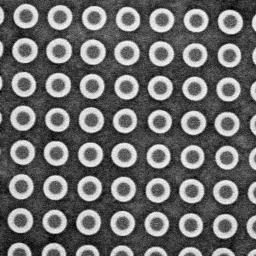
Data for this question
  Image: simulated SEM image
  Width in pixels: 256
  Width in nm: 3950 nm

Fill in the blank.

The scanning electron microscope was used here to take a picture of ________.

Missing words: an array of small figures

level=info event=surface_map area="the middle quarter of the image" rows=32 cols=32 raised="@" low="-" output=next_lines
--------------------------------
--------------------------------
--------------------------------
@----@@@@-----@@@-----@@@-------
@@--@@@@@@---@@@@@---@@@@@@---@@
@---@@@@@@---@@@@@---@@@@@@---@@
@---@@@@@@---@@@@@---@@@@@@---@@
@----@@@@----@@@@@----@@@@@---@@
------@@------@@@------@@@-----@
--------------------------------
--------------------------------
-----@@@@------@@---------------
@---@@@@@----@@@@@----@@@@----@@
@---@@@@@@--@@@@@@---@@@@@@---@@
@---@@@@@@--@@@@@@---@@@@@@--@@@
@---@@@@@@---@@@@@---@@@@@@---@@
-----@@@@----@@@@-----@@@@----@@
-------------------------------@
--------------------------------
--------------------------------
-----@@@@----@@@@-----@@@-------
@---@@@@@---@@@@@@---@@@@@----@@
@---@@@@@@--@@@@@@---@@@@@---@@@
@---@@@@@---@@@@@@---@@@@@---@@@
----@@@@@----@@@@@---@@@@@---@@@
------@@------@@------@@@-----@@
--------------------------------
--------------------------------
-----@@@------@@----------------
----@@@@@---@@@@@----@@@@@----@@
@---@@@@@---@@@@@@---@@@@@---@@@
@---@@@@@---@@@@@@---@@@@@---@@@